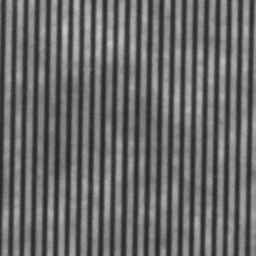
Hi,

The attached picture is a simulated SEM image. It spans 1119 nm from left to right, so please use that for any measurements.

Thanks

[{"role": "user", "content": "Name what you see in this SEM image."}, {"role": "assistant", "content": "parallel lines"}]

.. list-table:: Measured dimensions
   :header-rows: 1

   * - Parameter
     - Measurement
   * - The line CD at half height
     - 24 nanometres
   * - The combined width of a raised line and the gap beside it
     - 0.0493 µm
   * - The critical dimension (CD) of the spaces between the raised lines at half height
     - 24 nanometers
